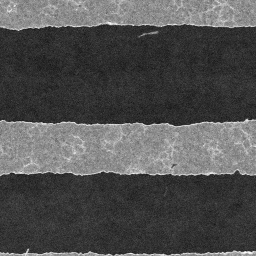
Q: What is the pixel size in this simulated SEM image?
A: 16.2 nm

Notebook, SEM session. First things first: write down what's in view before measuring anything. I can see one or a few lines or trenches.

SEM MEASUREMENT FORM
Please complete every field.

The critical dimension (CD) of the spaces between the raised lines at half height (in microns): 1.42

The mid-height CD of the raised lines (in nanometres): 816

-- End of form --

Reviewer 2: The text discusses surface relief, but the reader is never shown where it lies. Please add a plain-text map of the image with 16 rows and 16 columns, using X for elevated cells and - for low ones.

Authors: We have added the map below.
XXXXXXXXXXXXXXXX
XXXXXXXXXXX-XXXX
----------------
----------------
----------------
----------------
----------------
----------------
XXXXXXXXXXXXXXXX
XXXXXXXXXXXXXXXX
XXXXXXXXXXXXXXXX
----------------
----------------
----------------
----------------
----------------